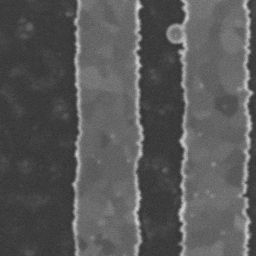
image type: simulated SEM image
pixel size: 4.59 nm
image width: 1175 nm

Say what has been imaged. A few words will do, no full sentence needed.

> one or a few lines or trenches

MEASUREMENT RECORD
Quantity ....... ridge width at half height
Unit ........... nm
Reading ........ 290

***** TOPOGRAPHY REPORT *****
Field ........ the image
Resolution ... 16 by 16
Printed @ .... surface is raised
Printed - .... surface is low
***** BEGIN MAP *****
-----@@@@---@@@-
-----@@@@--@@@@@
-----@@@@--@@@@-
-----@@@@--@@@@-
-----@@@@---@@@-
-----@@@@---@@@-
-----@@@@---@@@-
-----@@@@--@@@@@
-----@@@@--@@@@@
-----@@@@---@@@@
-----@@@@--@@@@-
-----@@@@--@@@@-
-----@@@@--@@@@-
-----@@@@--@@@@-
-----@@@@--@@@@-
-----@@@@--@@@@-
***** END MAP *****